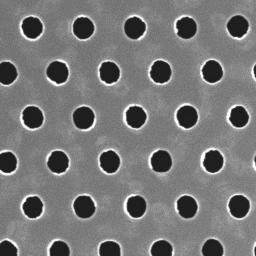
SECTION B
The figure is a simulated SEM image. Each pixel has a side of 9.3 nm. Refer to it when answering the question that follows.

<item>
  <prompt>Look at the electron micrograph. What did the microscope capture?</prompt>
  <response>a regular array of holes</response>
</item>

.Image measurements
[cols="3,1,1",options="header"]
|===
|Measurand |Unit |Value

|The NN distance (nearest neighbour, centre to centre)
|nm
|476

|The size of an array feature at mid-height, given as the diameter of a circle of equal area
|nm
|205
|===